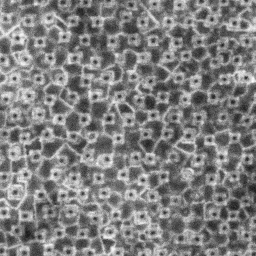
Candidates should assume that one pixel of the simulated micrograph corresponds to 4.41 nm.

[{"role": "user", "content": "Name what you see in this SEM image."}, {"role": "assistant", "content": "holes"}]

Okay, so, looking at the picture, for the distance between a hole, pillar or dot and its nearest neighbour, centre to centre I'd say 89.3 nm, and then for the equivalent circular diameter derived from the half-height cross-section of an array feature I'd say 3.56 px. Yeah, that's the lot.